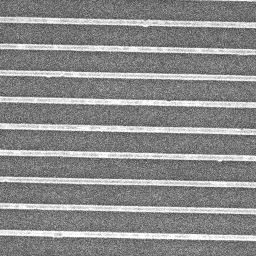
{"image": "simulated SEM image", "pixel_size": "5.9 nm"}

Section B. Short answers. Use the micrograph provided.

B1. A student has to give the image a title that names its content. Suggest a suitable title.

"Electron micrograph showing parallel lines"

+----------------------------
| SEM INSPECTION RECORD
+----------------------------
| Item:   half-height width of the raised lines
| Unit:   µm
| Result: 0.0273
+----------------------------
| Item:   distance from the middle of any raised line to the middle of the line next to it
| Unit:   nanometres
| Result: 157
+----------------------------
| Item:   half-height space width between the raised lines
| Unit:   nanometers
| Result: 129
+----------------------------